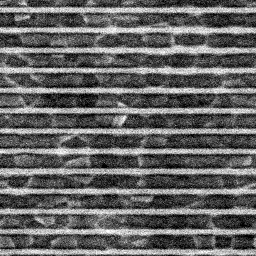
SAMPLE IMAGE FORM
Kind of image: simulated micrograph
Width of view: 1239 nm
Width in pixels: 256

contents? parallel lines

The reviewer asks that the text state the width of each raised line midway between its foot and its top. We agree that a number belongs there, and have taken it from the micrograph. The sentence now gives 20.6 nanometres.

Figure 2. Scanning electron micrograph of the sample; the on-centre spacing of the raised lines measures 97.5 nanometres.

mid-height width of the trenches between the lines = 0.078 microns